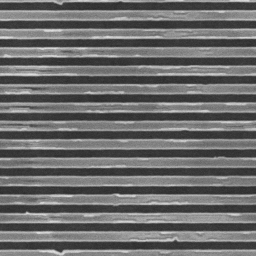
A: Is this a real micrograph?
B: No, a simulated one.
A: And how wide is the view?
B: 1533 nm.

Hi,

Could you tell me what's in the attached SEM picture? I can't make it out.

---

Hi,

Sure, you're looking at parallel lines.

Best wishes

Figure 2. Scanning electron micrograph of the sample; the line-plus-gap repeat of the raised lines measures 18.4 pixels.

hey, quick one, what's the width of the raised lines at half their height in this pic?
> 0.0569 micrometres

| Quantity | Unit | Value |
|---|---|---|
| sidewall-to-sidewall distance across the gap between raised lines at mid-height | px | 8.5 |